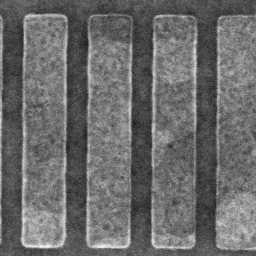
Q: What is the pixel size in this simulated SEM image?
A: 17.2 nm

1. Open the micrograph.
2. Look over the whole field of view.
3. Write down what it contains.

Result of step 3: wiring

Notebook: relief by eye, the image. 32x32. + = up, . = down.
................................
................................
...+++++...+++++...+++++...+++++
...+++++...+++++...+++++...+++++
...+++++...+++++...+++++...+++++
...+++++...+++++...+++++...+++++
...+++++...+++++...+++++...+++++
...+++++...+++++...+++++...+++++
...+++++...+++++...+++++...+++++
...+++++...+++++...+++++...+++++
...+++++...+++++...+++++...+++++
...+++++...+++++...+++++...+++++
...+++++...+++++...+++++...+++++
...+++++...+++++...+++++...+++++
...+++++...+++++...+++++...+++++
...+++++...+++++...+++++...+++++
...+++++...+++++...+++++...+++++
...+++++...+++++...+++++...+++++
...+++++...+++++...+++++...+++++
...+++++...+++++...+++++...+++++
...+++++...+++++...+++++...+++++
...+++++...+++++...+++++...+++++
...+++++...+++++...+++++...+++++
...+++++...+++++...+++++...+++++
...+++++...+++++...+++++...+++++
...+++++...+++++...+++++...+++++
...+++++...+++++...+++++...+++++
...+++++...+++++...+++++...+++++
...+++++...+++++...+++++...+++++
...+++++...+++++...+++++...+++++
...++++....+++++...+++++...+++++
................................